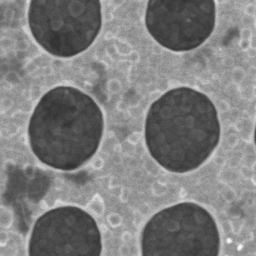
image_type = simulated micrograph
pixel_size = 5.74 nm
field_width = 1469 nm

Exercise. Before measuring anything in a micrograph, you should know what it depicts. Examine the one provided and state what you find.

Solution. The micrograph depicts holes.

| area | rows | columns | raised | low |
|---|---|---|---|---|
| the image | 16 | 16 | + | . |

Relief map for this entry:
++....+++....+++
++....+++....+++
++....++++...+++
++++++++++++++++
++++++++++++++++
++++.++++++.++++
++....++++...+++
++....+++.....++
++....+++.....++
++....+++....+++
+++..+++++..++++
++++++++++++++++
++++++++++++++++
+++...++++...+++
++....+++.....++
++....+++.....++